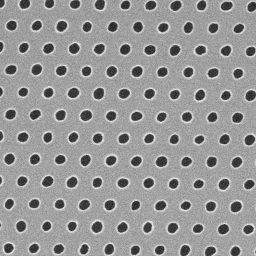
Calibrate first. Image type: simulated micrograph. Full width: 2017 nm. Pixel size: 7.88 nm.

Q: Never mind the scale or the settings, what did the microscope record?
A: a regular array of holes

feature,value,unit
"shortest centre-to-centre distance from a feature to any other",24.9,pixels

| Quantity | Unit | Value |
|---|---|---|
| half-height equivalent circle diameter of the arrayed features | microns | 0.081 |